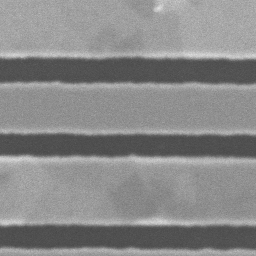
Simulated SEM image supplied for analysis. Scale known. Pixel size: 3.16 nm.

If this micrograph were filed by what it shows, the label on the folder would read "lines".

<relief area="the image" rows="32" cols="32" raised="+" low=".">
++++++++++++++++++++++++++++++++
++++++++++++++++++++++++++++++++
++++++++++++++++++++++++++++++++
++++++++++++++++++++++++++++++++
++++++++++++++++++++++++++++++++
++++++++++++++++++++++++++++++++
++++++++++++++++++++++++++++++++
................................
................................
................................
+++++++++.+++++++++++..++.......
++++++++++++++++++++++++++++++++
++++++++++++++++++++++++++++++++
++++++++++++++++++++++++++++++++
++++++++++++++++++++++++++++++++
++++++++++++++++++++++++++++++++
++++++++++++++++++++++++++++++++
................................
................................
................................
++++++++++++++++++++++++++++++++
++++++++++++++++++++++++++++++++
++++++++++++++++++++++++++++++++
++++++++++++++++++++++++++++++++
++++++++++++++++++++++++++++++++
++++++++++++++++++++++++++++++++
++++++++++++++++++++++++++++++++
++++++++++++++++++++++++++++++++
................................
................................
................................
++++++++++++++++++++++++++++++++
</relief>